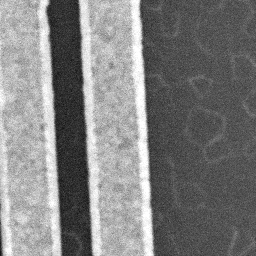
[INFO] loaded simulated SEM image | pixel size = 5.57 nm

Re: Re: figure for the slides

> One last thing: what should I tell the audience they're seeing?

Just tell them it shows one or a few lines or trenches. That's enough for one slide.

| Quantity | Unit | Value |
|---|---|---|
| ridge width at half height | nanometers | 287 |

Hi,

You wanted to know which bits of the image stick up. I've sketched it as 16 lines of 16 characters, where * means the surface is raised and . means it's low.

***..***........
***..****.......
***..****.......
***..****.......
***..****.......
***..****.......
***...***.......
***...***.......
***...***.......
***...***.......
***...***.......
***...***.......
***...***.......
***...***.......
****..***.......
****..***.......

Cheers